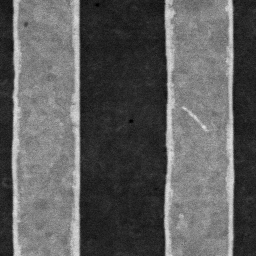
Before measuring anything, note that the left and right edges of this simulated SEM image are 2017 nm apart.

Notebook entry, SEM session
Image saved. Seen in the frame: one or a few lines or trenches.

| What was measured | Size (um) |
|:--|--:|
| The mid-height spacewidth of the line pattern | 0.717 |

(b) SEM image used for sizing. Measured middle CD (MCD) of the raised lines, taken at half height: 489 nm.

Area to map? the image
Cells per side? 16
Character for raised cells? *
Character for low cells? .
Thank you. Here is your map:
.****.....****..
.****.....****..
.****.....****..
.****......***..
.****......***..
.****......***..
.****......***..
.****......***..
.****......***..
.****......***..
.****......***..
.****......***..
.****.....****..
.****.....****..
.****.....****..
.****.....****..